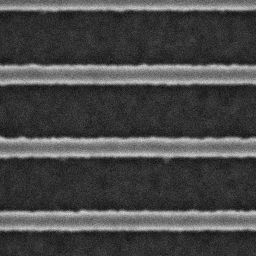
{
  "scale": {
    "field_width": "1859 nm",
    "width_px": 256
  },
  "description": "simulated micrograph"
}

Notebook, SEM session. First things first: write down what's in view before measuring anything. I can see lines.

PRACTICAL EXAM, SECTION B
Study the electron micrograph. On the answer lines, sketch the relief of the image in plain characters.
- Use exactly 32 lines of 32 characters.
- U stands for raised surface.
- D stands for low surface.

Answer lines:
UUUUUUUUUUUUUUUUUUUUUUUUUUUUUUUU
DDDDDDDDDDDDDDDDDDDDDDDDDDDDDDDD
DDDDDDDDDDDDDDDDDDDDDDDDDDDDDDDD
DDDDDDDDDDDDDDDDDDDDDDDDDDDDDDDD
DDDDDDDDDDDDDDDDDDDDDDDDDDDDDDDD
DDDDDDDDDDDDDDDDDDDDDDDDDDDDDDDD
DDDDDDDDDDDDDDDDDDDDDDDDDDDDDDDD
DDDDDDDDDDDDDDDDDDDDDDDDDDDDDDDD
UUUUUUUUUUUUUUUUUUUUUUUUUUUUUUUU
UUUUUUUUUUUUUUUUUUUUUUUUUUUUUUUU
UDDDDDDDDDDDUDDDDDDUDUUUDDDDDDDD
DDDDDDDDDDDDDDDDDDDDDDDDDDDDDDDD
DDDDDDDDDDDDDDDDDDDDDDDDDDDDDDDD
DDDDDDDDDDDDDDDDDDDDDDDDDDDDDDDD
DDDDDDDDDDDDDDDDDDDDDDDDDDDDDDDD
DDDDDDDDDDDDDDDDDDDDDDDDDDDDDDDD
DDDDDDDDDDDDDDDDDDDDDDDDDDDDDDDD
UUUUUUUUUUUUUUUUUUUUUUUUUUUUUUUU
UUUUUUUUUUUUUUUUUUUUUUUUUUUUUUUU
UUUUDUUDDDUUDDDDDDDDDUDDDDDDDDUD
DDDDDDDDDDDDDDDDDDDDDDDDDDDDDDDD
DDDDDDDDDDDDDDDDDDDDDDDDDDDDDDDD
DDDDDDDDDDDDDDDDDDDDDDDDDDDDDDDD
DDDDDDDDDDDDDDDDDDDDDDDDDDDDDDDD
DDDDDDDDDDDDDDDDDDDDDDDDDDDDDDDD
DDDDDDDDDDDDDDDDDDDDDDDDDDDDDDDD
DDDDDDDDDDUUDUUUDDUDDDDUUDDUUUDU
UUUUUUUUUUUUUUUUUUUUUUUUUUUUUUUU
UUUUUUUUUUUUUUUUUUUUUUUUUUUUUUUU
DDDDDDDDDDDDDDDDDDDDDDDDDDDDDDDD
DDDDDDDDDDDDDDDDDDDDDDDDDDDDDDDD
DDDDDDDDDDDDDDDDDDDDDDDDDDDDDDDD